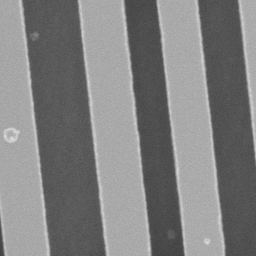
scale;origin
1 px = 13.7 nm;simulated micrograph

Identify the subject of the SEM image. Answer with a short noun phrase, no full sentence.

lines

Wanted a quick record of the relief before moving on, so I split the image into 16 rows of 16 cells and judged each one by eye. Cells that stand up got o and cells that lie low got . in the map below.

o....ooo..oo...o
oo...ooo..oo...o
oo...ooo..ooo..o
oo...ooo..ooo..o
oo...ooo..ooo..o
oo...ooo..ooo...
oo....oo...oo...
oo....ooo..oo...
oo....ooo..oo...
oo....ooo..oo...
ooo...ooo..oo...
ooo...ooo..ooo..
ooo...ooo..ooo..
ooo...ooo..ooo..
ooo...ooo..ooo..
ooo....oo...oo..